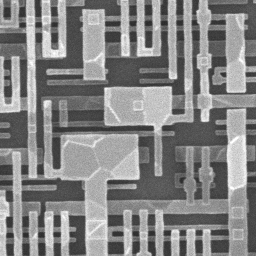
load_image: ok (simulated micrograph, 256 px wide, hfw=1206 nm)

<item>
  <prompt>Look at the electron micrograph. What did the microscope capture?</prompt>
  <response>wiring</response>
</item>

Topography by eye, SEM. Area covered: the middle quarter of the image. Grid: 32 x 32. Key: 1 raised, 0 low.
00000111110000000000000000110011
00000111110000000000000000110011
00000111110000000000000000110011
00000111110000000000000000010011
00000000000000000000000000000011
00000000000000000000000000000011
00000000001111111111111111100011
00000000001111111111111111100011
00000000001111111111111111100011
10000000001111111111111111100011
10000000001111111111111111100011
10000000001111111111111111100011
10000000001111111111111111100011
10000000001111111111111111111111
10000000001111111111111111110000
10000000000000000000001110000000
00000000000000000000000100000000
00000000000000000000000100000000
11111111111111111100000100000000
11111111111111111100000100000000
11111111111111111100000100000000
11111111111111111100000100000001
11111111111111111100000100000001
11111111111111111100000100000001
11111111111111111110000100000001
11111111111111111110000100000001
11111111111111111110000110000001
11111111111111111110000110000001
11111111111111111110000000000011
00000111111000000000000000000011
00000111111000000000000000000011
00000111111000000000000000000011